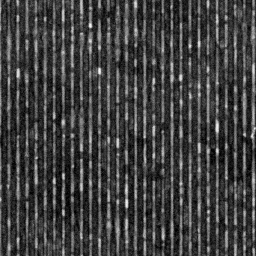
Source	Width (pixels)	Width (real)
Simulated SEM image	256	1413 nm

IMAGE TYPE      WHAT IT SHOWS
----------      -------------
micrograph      parallel lines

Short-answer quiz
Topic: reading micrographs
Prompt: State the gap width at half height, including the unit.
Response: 40 nm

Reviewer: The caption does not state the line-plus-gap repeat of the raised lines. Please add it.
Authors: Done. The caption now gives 50.1 nm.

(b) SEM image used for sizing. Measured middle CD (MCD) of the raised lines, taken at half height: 9 nanometres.